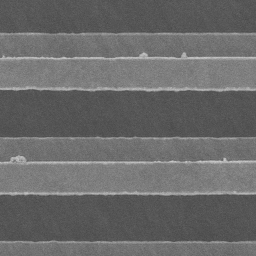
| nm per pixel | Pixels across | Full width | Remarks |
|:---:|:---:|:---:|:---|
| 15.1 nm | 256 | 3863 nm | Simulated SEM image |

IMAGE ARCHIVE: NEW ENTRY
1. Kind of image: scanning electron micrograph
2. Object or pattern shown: lines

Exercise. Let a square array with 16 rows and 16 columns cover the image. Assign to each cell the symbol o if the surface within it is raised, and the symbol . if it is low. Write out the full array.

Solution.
................
................
oooooooooooooooo
oooooooooooooooo
oooooooooooooooo
oooooooooooooooo
................
................
................
oooooooooooooooo
oooooooooooooooo
oooooooooooooooo
................
................
................
oooooooooooooooo